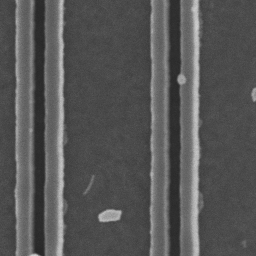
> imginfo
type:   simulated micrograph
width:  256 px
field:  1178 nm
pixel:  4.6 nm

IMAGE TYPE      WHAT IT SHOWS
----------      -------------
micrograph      lines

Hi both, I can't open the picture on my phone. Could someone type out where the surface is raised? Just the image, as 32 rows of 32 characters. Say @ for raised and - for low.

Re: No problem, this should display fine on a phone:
--@@--@@-----------@@--@@-------
--@@--@@-----------@@--@@-------
--@@--@@-----------@@--@@-------
--@@--@@-----------@@--@@-------
--@@--@@-----------@@--@@-------
--@@--@@-----------@@--@@-------
--@@--@@-----------@@--@@-------
--@@--@@-----------@@--@@-------
--@@--@@-----------@@--@@-------
--@@--@@-----------@@-@@@-------
--@@--@@-----------@@-@@@-------
--@@--@@-----------@@--@@-------
--@@--@@-----------@@--@@-------
--@@--@@-----------@@--@@-------
--@@--@@-----------@@--@@-------
--@@--@@-----------@@--@@-------
--@@--@@-----------@@--@@-------
--@@--@@-----------@@--@@-------
--@@--@@-----------@@--@@-------
--@@--@@-----------@@--@@-------
--@@--@@-----------@@--@@-------
--@@--@@-----------@@--@@-------
--@@--@@-----------@@--@@-------
--@@--@@-----------@@--@@-------
--@@--@@-----------@@--@@-------
--@@--@@-----------@@--@@-------
--@@--@@-----------@@--@@-------
--@@--@@-----------@@--@--------
--@@--@@-----------@@--@@-------
--@@--@@-----------@@--@@-------
--@@--@@-----------@@--@@-------
--@@--@@-----------@@--@@-------